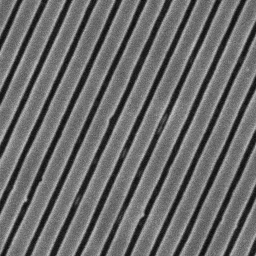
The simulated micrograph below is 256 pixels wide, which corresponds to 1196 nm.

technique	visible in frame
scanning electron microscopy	parallel lines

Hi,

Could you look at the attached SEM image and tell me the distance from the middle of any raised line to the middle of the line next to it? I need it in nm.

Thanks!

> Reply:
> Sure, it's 106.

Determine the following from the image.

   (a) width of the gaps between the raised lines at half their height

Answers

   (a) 30.8 nanometers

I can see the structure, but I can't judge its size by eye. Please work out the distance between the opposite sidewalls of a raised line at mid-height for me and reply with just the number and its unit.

75.4 nanometres